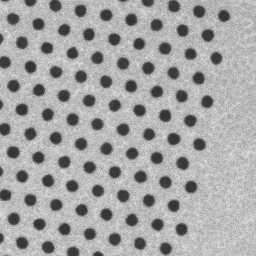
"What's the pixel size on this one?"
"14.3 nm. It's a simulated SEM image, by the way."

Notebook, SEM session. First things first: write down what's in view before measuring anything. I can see a regular array of holes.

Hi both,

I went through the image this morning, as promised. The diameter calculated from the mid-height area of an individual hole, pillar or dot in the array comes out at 179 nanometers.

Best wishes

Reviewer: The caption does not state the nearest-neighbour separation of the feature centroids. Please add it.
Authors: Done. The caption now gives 0.355 µm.